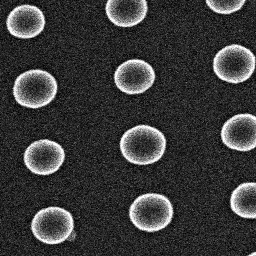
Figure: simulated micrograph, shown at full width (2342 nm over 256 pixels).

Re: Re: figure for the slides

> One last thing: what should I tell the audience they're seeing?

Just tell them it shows a regular array of raised bodies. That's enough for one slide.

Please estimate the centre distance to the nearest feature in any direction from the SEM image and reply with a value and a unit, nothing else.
625 nm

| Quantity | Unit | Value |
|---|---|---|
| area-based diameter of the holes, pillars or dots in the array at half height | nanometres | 347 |